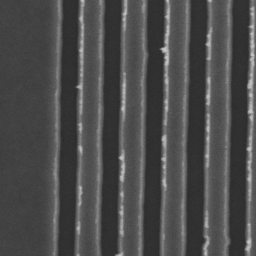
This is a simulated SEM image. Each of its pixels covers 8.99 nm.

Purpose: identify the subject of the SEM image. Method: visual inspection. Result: parallel lines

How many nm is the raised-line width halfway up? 206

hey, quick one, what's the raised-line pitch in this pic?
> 383 nanometers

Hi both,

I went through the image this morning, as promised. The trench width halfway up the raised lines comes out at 0.172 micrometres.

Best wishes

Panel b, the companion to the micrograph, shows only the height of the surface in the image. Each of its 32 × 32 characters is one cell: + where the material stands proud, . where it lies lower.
++++++++..+++..+++...+++..+++..+
++++++++..+++..+++...+++..+++..+
++++++++..+++..+++...+++..+++..+
++++++++..+++..+++...+++..+++..+
++++++++..+++..+++...+++..+++..+
++++++++..+++..+++...++...+++..+
+++++++...+++..+++..+++...+++..+
+++++++...+++..+++...++...+++..+
+++++++...+++..+++...++...+++..+
+++++++...+++..+++...++...+++..+
+++++++...+++..+++...++...+++..+
+++++++...+++..+++...++...+++..+
+++++++...+++..+++...++...+++..+
+++++++...+++..+++...++...+++..+
+++++++...+++..+++...++...+++..+
+++++++...+++..+++...++...+++..+
+++++++...+++..+++..+++...+++..+
+++++++...+++..+++..+++...+++..+
+++++++...+++..+++..+++...+++..+
+++++++...+++..+++..+++...+++..+
+++++++...+++..+++..+++...+++..+
+++++++...+++..+++..+++...+++..+
+++++++...+++..+++..+++...++...+
+++++++...+++..+++..+++...++...+
+++++++...+++..+++..+++...++...+
+++++++...++...+++..+++...++...+
+++++++...++...+++..+++...++...+
+++++++...++...+++..+++...++...+
+++++++...++...+++..+++...++...+
+++++++...++...+++..+++...++...+
+++++++...++...+++..+++...+++..+
+++++++...++...+++..+++..+++...+